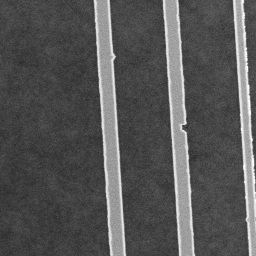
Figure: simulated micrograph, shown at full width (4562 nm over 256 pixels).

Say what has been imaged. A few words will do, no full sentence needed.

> one or a few lines or trenches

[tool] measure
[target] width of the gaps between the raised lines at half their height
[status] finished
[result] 998 nm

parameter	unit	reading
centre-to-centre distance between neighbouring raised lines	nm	1210